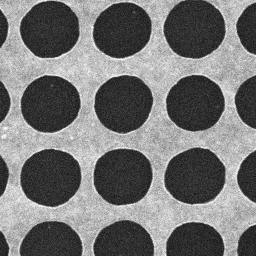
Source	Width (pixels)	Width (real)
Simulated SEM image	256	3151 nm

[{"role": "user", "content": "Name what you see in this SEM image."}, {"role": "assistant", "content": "holes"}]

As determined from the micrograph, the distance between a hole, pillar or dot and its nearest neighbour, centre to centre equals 888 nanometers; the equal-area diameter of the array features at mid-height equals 724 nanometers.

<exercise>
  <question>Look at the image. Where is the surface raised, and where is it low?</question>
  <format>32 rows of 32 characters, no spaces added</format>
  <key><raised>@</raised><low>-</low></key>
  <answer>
@@@@@---@@@@@@---@@@@@----@@@@@-
@@@------@@@@-----@@@-------@@--
-@@-------@@-------@@-------@@--
-@@-------@@-------@--------@@--
-@@-------@@-------@@-------@@--
@@@------@@@------@@@-------@@--
@@@@----@@@@@----@@@@@-----@@@@-
@@@@@@@@@@@@@@@@@@@@@@@@@@@@@@@@
@@@@@@@@@@@@@@@@@@@@@@@@@@@@@@@@
@@@@@--@@@@@@@@-@@@@@@@---@@@@@@
@@@@-----@@@@-----@@@@-----@@@--
-@@-------@@-------@@-------@@--
-@@-------@@-------@@-------@---
-@@-------@@-------@@-------@---
-@@-------@@-------@@-------@@--
@@@@-----@@@@-----@@@@-----@@@@-
@@@@@--@@@@@@@--@@@@@@@@@@@@@@@@
@@@@@@@@@@@@@@@@@@@@@@@@@@@@@@@@
@@@@@@@@@@@@@@@@@@@@@@@@-@@@@@@@
@@@@-----@@@@-----@@@@-----@@@@-
-@@-------@@-------@@-------@@--
-@@-------@@-------@@-------@@--
-@@-------@@-------@--------@@--
-@@-------@@-------@@-------@@--
@@@------@@@@-----@@@@-----@@@@-
@@@@@---@@@@@@---@@@@@@@@@@@@@@@
@@@@@@@@@@@@@@@@@@@@@@@@@@@@@@@@
@@@@@@@@@@@@@@@@@@@@@@@@@@@@@@@@
@@@@-----@@@@-----@@@@-----@@@@-
-@@-------@@-------@@-------@@--
-@@-------@@-------@@-------@@--
-@--------@@-------@@-------@@--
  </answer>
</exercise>